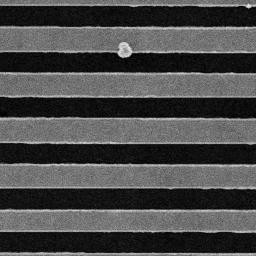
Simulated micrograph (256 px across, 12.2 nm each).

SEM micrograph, lines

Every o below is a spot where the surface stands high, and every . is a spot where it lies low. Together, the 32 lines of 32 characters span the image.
oooooooooooooooooooooooooooooooo
................................
................................
oooooooooooooooooooooooooooooooo
oooooooooooooooooooooooooooooooo
oooooooooooooooooooooooooooooooo
o....o.ooooooooooooooooooooooooo
................................
................................
oooooooooooooooooooooooooooooooo
oooooooooooooooooooooooooooooooo
oooooooooooooooooooooooooooooooo
................................
................................
................................
oooooooooooooooooooooooooooooooo
oooooooooooooooooooooooooooooooo
oooooooooooooooooooooooooooooooo
................................
................................
oooo...ooooo....................
oooooooooooooooooooooooooooooooo
oooooooooooooooooooooooooooooooo
.....................o...oo.oooo
................................
................................
oooooooooooooooooooooooooooooooo
oooooooooooooooooooooooooooooooo
oooooooooooooooooooooooooooooooo
................................
................................
................................